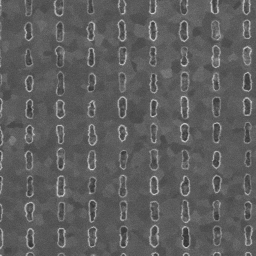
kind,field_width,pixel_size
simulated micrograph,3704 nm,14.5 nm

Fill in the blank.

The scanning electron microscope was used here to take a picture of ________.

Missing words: a regular array of holes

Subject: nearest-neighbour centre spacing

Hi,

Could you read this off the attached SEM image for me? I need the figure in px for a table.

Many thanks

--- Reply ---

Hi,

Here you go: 24.8